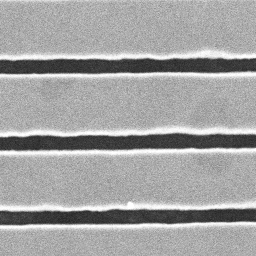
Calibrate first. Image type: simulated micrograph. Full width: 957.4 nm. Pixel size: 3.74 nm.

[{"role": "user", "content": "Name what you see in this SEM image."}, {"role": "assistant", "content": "lines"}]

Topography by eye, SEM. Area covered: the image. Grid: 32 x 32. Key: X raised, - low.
XXXXXXXXXXXXXXXXXXXXXXXXXXXXXXXX
XXXXXXXXXXXXXXXXXXXXXXXXXXXXXXXX
XXXXXXXXXXXXXXXXXXXXXXXXXXXXXXXX
XXXXXXXXXXXXXXXXXXXXXXXXXXXXXXXX
XXXXXXXXXXXXXXXXXXXXXXXXXXXXXXXX
XXXXXXXXXXXXXXXXXXXXXXXXXXXXXXXX
XXXXXXXXXXXXXXXXXXXXXXXXXXXXXXXX
-X------------------------------
--------------------------------
XXXXXXXXXXXXXXXXXXXXXXXXXXXXXXXX
XXXXXXXXXXXXXXXXXXXXXXXXXXXXXXXX
XXXXXXXXXXXXXXXXXXXXXXXXXXXXXXXX
XXXXXXXXXXXXXXXXXXXXXXXXXXXXXXXX
XXXXXXXXXXXXXXXXXXXXXXXXXXXXXXXX
XXXXXXXXXXXXXXXXXXXXXXXXXXXXXXXX
XXXXXXXXXXXXXXXXXXXXXXXXXXXXXXXX
XXXXXXXXXXXXXXXXXXXXXXXXXXXXXXXX
--------------------------------
--------------------------------
XXXXXXXXXXXXXXXXXXXXXXXXXXXXXXXX
XXXXXXXXXXXXXXXXXXXXXXXXXXXXXXXX
XXXXXXXXXXXXXXXXXXXXXXXXXXXXXXXX
XXXXXXXXXXXXXXXXXXXXXXXXXXXXXXXX
XXXXXXXXXXXXXXXXXXXXXXXXXXXXXXXX
XXXXXXXXXXXXXXXXXXXXXXXXXXXXXXXX
XXXXXXXXXXXXXXXXXXXXXXXXXXXXXXXX
--------------------------------
--------------------------------
XXXXXXXXXXXXXXXXXXXXXXXXXXXXXXXX
XXXXXXXXXXXXXXXXXXXXXXXXXXXXXXXX
XXXXXXXXXXXXXXXXXXXXXXXXXXXXXXXX
XXXXXXXXXXXXXXXXXXXXXXXXXXXXXXXX